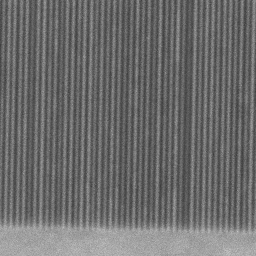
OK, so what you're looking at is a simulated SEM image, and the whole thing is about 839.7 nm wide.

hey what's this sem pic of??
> parallel lines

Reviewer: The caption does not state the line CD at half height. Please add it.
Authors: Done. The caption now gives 0.0086 microns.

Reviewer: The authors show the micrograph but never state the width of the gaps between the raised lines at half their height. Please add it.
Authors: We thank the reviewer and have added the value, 11.5 nm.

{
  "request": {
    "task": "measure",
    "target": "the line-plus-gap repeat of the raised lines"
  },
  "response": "19.1 nm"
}